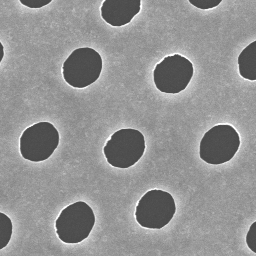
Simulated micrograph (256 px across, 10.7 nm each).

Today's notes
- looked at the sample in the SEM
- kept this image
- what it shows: holes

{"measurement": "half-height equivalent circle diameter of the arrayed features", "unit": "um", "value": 0.425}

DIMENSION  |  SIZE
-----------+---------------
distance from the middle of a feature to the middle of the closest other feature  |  0.898 micrometres